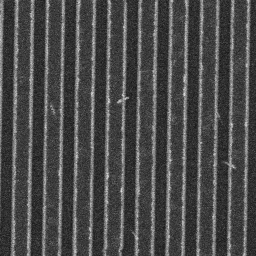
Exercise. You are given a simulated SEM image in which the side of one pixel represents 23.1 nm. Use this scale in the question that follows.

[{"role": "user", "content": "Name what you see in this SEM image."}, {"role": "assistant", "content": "parallel lines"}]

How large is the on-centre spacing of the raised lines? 30.8 px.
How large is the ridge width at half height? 399 nm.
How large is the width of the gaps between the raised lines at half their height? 318 nanometres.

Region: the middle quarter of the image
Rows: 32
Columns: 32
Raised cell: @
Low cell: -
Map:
---@@@@----@@@@----@@@@----@@@--
---@@@@----@@@@----@@@@----@@@--
---@@@@----@@@@----@@@@----@@@--
---@@@@----@@@@----@@@@----@@@--
---@@@@----@@@@----@@@@----@@@--
---@@@@----@@@@----@@@@---@@@@--
---@@@@----@@@@----@@@@---@@@@--
---@@@@----@@@@----@@@@---@@@@--
---@@@@----@@@@@---@@@@---@@@@--
---@@@@----@@@@----@@@@---@@@@--
---@@@@----@@@@----@@@@---@@@@--
---@@@@----@@@@----@@@@---@@@@--
---@@@@----@@@@----@@@@---@@@@--
---@@@@----@@@@----@@@----@@@@--
---@@@@----@@@@----@@@----@@@@--
---@@@@----@@@@----@@@----@@@@--
---@@@@----@@@@----@@@----@@@@--
---@@@@----@@@@----@@@----@@@@--
---@@@@----@@@@----@@@----@@@@--
---@@@@----@@@@----@@@@---@@@@--
---@@@@----@@@@----@@@@---@@@@--
---@@@@----@@@@----@@@@---@@@@--
---@@@@----@@@@---@@@@@---@@@@--
---@@@@----@@@@---@@@@----@@@@--
---@@@@----@@@@---@@@@@---@@@@--
---@@@@----@@@@---@@@@@---@@@@--
---@@@@----@@@@---@@@@----@@@@--
---@@@@----@@@@---@@@@----@@@@--
---@@@@----@@@@---@@@@----@@@@--
---@@@@----@@@@---@@@@----@@@@--
---@@@@----@@@@---@@@@----@@@@--
---@@@@----@@@@---@@@@----@@@@--